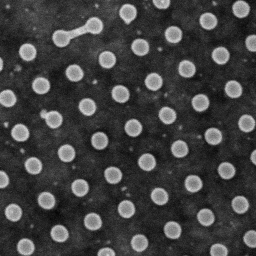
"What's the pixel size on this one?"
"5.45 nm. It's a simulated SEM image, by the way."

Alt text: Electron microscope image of a regular array of raised bodies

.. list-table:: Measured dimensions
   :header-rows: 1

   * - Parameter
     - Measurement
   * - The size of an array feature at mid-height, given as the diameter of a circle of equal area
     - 90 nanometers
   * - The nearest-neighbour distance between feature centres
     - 192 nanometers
